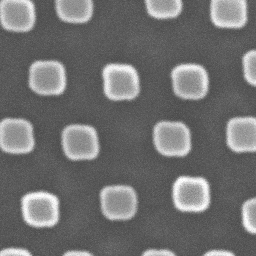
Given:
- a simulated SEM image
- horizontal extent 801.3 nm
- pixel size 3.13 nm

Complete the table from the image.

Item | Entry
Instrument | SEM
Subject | a regular array of raised bodies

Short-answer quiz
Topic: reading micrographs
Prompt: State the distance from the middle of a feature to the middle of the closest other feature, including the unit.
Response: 220 nanometres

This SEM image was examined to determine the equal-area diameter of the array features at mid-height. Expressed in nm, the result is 110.